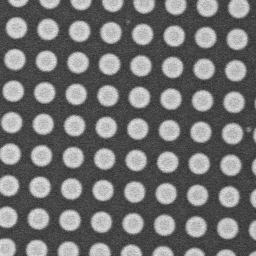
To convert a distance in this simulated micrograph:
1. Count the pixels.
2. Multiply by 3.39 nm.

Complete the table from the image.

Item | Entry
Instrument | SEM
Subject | an array of small figures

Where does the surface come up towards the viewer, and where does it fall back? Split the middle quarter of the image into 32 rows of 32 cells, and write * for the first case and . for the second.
.*****...*****...*****...*****..
..***....*****...*****...*****..
..........**......***....****...
................................
................................
.****.....**....................
.****....****....****.....**....
******..*****...*****...*****...
.****...*****...*****...*****...
.****....****...*****...*****...
.................***.....****...
................................
................................
.***......**....................
*****...*****....***.....***....
*****...*****...*****...*****...
*****...*****...*****...*****...
.***.....****...*****...*****...
.................***.....***....
................................
................................
.***.....**.....................
*****...****....****....****....
*****...*****...*****...****....
*****...*****..*****...*****...*
.***....****....****...*****...*
.................**.....****....
................................
................................
****....***.....................
****...*****....****....***.....
****...*****...*****...*****...*